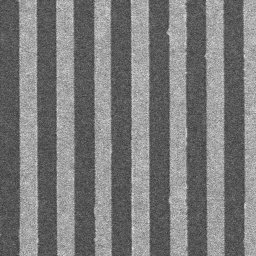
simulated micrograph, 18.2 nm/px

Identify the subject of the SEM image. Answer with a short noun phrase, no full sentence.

parallel lines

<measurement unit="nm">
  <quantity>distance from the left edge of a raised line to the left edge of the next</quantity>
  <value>681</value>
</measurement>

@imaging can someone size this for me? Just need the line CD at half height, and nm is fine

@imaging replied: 310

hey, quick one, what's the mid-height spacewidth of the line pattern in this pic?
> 383 nm